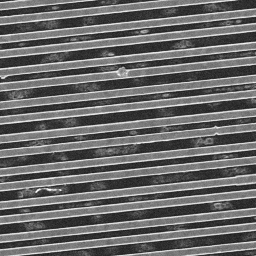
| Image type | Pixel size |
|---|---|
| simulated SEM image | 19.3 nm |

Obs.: parallel lines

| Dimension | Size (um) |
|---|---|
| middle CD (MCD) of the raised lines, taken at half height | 0.144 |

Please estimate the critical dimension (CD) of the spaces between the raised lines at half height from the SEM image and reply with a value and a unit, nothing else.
0.201 µm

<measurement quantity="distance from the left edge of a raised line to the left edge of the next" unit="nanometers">318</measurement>